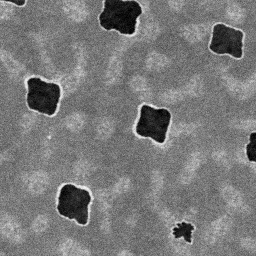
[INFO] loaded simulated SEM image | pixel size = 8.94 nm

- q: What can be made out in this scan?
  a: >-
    holes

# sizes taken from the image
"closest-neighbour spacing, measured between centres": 994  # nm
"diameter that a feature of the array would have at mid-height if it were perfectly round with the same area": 320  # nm